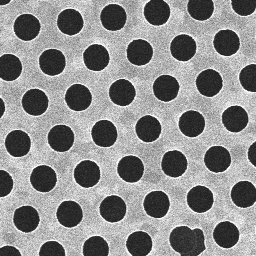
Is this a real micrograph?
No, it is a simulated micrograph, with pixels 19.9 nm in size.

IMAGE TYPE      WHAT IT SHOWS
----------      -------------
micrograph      a regular array of holes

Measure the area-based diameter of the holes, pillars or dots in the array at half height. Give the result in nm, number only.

539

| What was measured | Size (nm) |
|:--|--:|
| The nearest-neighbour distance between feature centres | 864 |